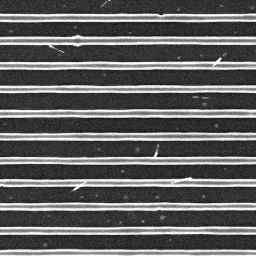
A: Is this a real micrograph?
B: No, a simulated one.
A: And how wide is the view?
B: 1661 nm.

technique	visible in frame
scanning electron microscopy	parallel lines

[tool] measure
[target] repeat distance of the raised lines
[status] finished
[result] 0.154 um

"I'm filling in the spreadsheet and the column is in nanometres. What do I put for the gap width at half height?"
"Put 116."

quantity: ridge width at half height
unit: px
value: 6.26